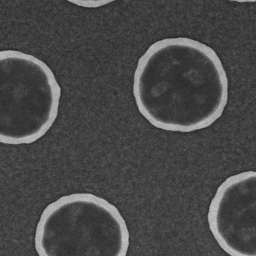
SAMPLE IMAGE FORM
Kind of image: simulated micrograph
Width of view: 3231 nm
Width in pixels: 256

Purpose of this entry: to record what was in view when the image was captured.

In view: raised bodies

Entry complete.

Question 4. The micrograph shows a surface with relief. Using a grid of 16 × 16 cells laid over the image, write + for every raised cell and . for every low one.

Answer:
................
................
................
++.......++++...
+++......+++++..
+++......+++++..
+++......+++++..
+++......++++...
++..............
................
................
..............++
....++........++
...++++......+++
..++++++.....+++
..++++++......++